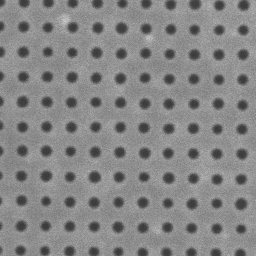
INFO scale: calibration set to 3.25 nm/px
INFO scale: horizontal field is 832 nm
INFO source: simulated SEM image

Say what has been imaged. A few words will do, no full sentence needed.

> a regular array of holes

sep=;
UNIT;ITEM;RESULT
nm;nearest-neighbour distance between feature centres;78.5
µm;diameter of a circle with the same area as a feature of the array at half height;0.0377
